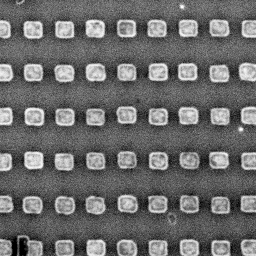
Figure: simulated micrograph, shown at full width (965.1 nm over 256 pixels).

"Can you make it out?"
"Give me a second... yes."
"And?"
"a regular array of raised bodies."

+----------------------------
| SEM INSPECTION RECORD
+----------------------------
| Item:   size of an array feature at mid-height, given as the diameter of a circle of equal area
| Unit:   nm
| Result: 68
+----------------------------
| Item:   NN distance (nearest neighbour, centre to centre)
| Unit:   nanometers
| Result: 115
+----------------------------